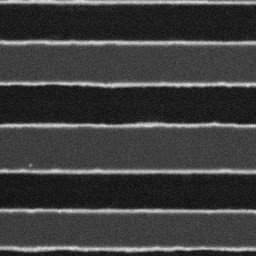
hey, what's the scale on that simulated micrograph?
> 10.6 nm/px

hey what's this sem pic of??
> lines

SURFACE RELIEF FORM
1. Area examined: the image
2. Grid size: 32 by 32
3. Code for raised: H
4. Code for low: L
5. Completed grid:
LLLLLLLLLLLLLLLLLLLLLLLLLLLLLLLL
LLLLLLLLLLLLLLLLLLLLLLLLLLLLLLLL
LLLLLLLLLLLLLLLLLLLLLLLLLLLLLLLL
LLLLLLLLLLLLLLLLLLLLLLLLLLLLLLLL
LLLLLLLLLLLLLLLLLLLLLLLLLLLLLLLL
HHHHHHHHHHHHHHHHHHHHHHHHHHHHHHHH
HHHHHHHHHHHHHHHHHHHHHHHHHHHHHHHH
HHHHHHHHHHHHHHHHHHHHHHHHHHHHHHHH
HHHHHHHHHHHHHHHHHHHHHHHHHHHHHHHH
HHHHHHHHHHHHHHHHHHHHHHHHHHHHHHHH
LLLLLLLLLLLLHHHHHLLLLHHHLHLLHHHH
LLLLLLLLLLLLLLLLLLLLLLLLLLLLLLLL
LLLLLLLLLLLLLLLLLLLLLLLLLLLLLLLL
LLLLLLLLLLLLLLLLLLLLLLLLLLLLLLLL
LLLLLLLLLLLLLLLLLLLLLLLLLLLLLLLL
LLLLLLLLLLLLLLLLLLLLLLLLLLLLLLLL
HHHHHHHHHHHHHHHHHHHHHHHHHHHHHHHH
HHHHHHHHHHHHHHHHHHHHHHHHHHHHHHHH
HHHHHHHHHHHHHHHHHHHHHHHHHHHHHHHH
HHHHHHHHHHHHHHHHHHHHHHHHHHHHHHHH
HHHHHHHHHHHHHHHHHHHHHHHHHHHHHHHH
LLLLLLLLLLLLLLLLLLLLLLLLLLLLLLLL
LLLLLLLLLLLLLLLLLLLLLLLLLLLLLLLL
LLLLLLLLLLLLLLLLLLLLLLLLLLLLLLLL
LLLLLLLLLLLLLLLLLLLLLLLLLLLLLLLL
LLLLLLLLLLLLLLLLLLLLLLLLLLLLLLLL
HHHHHHHHHHHHHHHHHHHHHHHHHHHHHHHH
HHHHHHHHHHHHHHHHHHHHHHHHHHHHHHHH
HHHHHHHHHHHHHHHHHHHHHHHHHHHHHHHH
HHHHHHHHHHHHHHHHHHHHHHHHHHHHHHHH
HHHHHHHHHHHHHHHHHHHHHHHHHHHHHHHH
LLLLLLLLLLLLLLLLLLLLLLLLLLLLLLLL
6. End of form